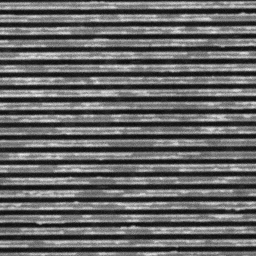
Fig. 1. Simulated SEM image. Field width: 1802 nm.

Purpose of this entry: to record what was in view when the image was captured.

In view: parallel lines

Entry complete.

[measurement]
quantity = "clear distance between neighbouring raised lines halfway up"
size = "41.4 nm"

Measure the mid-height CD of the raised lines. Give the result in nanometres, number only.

48.4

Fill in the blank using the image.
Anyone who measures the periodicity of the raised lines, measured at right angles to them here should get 88.1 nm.